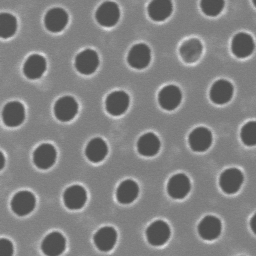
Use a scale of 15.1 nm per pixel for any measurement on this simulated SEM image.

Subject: a regular array of holes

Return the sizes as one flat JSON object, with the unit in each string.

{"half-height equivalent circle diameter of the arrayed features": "384 nm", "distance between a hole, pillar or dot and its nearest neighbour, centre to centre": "772 nm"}